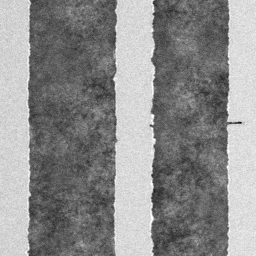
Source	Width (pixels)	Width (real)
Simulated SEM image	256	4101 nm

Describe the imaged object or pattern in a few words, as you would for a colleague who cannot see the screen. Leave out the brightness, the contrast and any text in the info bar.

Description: one or a few lines or trenches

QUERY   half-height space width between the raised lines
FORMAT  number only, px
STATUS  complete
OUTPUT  78.7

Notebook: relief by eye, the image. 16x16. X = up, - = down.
XX-----XXX----XX
XX-----XXX----XX
XX-----XXX----XX
XX-----XX-----XX
XX-----XXX----XX
XX-----XXX----XX
XX-----XX-----XX
XX-----XX-----XX
XX-----XXX----XX
XX-----XXX----XX
XX-----XX-----XX
XX-----XXX----XX
XX-----XX-----XX
XX-----XX-----XX
XX-----XX-----XX
XX-----XXX----XX